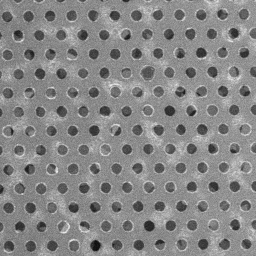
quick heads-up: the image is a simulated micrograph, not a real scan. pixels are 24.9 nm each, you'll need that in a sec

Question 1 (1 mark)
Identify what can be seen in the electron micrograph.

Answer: a regular array of raised bodies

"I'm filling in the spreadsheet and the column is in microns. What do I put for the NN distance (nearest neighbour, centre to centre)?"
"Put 0.534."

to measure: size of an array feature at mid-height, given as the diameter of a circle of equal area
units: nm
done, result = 286